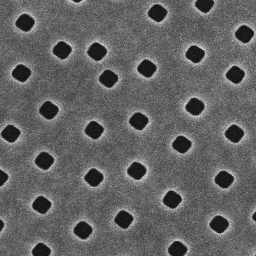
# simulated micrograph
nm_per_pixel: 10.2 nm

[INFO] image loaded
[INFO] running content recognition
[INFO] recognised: a regular array of holes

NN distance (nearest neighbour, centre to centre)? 0.449 µm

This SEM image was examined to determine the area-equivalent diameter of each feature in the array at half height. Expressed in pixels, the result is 17.7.